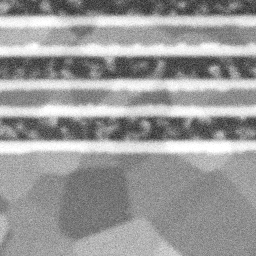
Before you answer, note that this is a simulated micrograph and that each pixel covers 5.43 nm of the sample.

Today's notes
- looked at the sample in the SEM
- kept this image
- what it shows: parallel lines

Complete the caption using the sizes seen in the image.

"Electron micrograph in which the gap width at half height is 184 nanometres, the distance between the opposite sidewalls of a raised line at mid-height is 154 nm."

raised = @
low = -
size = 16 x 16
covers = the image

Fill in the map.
----------------
@@@@@@@@@@@@@@@@
@@@@@@@@@@@@@@@@
----------------
----------------
@@@@@@@@@@@@@@@@
@@@@@@@@@@@@@@@@
----------------
----------------
@@@@@@@@@@@@@@@@
@@@@@@@@@@@@@@@@
@@@@@@@@@@@@@@@@
@@@@@@@@@@@@@@@@
@@@@@@@@@@@@@@@@
@@@@@@@@@@@@@@@@
@@@@@@@@@@@@@@@@